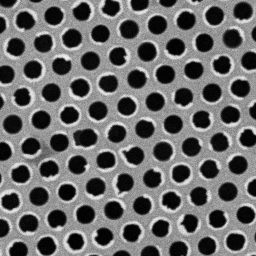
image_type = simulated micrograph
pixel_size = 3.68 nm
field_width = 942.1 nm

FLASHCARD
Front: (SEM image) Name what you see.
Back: a regular array of holes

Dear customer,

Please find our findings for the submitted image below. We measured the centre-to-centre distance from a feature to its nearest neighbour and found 105 nanometers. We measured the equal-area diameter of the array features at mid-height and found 17.8 pixels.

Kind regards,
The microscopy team